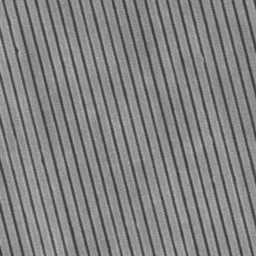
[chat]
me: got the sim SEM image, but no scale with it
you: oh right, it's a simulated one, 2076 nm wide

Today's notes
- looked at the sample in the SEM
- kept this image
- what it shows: parallel lines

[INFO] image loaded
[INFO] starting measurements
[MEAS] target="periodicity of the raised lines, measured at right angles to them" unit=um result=0.086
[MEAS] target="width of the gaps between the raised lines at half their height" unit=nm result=23.6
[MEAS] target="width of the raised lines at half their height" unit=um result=0.0619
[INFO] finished